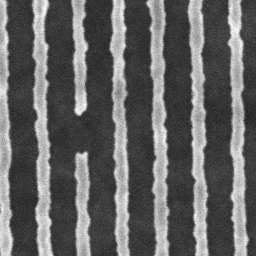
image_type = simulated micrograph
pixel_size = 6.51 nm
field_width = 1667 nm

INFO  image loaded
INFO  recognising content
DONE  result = parallel lines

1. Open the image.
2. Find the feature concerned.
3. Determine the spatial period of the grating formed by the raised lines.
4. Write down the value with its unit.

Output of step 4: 255 nm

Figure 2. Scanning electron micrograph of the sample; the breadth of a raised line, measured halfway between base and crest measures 74 nanometres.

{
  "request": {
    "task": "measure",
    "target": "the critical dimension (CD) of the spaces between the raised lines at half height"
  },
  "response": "179 nm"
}